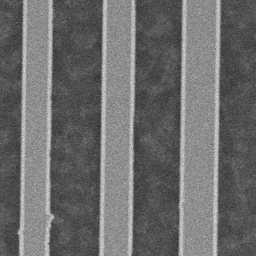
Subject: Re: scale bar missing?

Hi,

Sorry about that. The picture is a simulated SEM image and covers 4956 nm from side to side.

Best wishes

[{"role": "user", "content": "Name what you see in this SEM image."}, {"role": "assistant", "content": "one or a few lines or trenches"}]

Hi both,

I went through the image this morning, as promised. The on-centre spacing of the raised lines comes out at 1.58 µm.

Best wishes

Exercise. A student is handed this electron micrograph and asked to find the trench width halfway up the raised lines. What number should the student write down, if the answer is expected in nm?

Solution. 989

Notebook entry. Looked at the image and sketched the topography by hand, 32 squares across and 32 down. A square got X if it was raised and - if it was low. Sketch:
---XXX-------XXXX------XXXX-----
---XXX-------XXXX------XXXX-----
---XXX-------XXXX------XXXX-----
---XXX-------XXXX------XXXX-----
---XXX-------XXXX------XXXX-----
---XXX-------XXXX------XXXX-----
---XXX-------XXXX------XXXX-----
---XXX-------XXXX------XXXX-----
---XXX-------XXXX------XXXX-----
---XXX-------XXXX------XXXX-----
---XXX-------XXXX------XXXX-----
---XXX-------XXXX------XXXX-----
---XXX-------XXXX------XXXX-----
---XXX-------XXXX------XXXX-----
---XXX-------XXXX------XXXX-----
---XXX-------XXX-------XXXX-----
---XXX-------XXX-------XXXX-----
---XXX-------XXX-------XXXX-----
---XXX-------XXX-------XXXX-----
---XXX-------XXX-------XXXX-----
---XXX-------XXX-------XXXX-----
---XXX-------XXX-------XXXX-----
---XXX-------XXX-------XXXX-----
---XXX-------XXX-------XXXX-----
---XXX-------XXX-------XXXX-----
---XXX-------XXX-------XXXX-----
---XXX-------XXX-------XXXX-----
---XXX-------XXX-------XXXX-----
---XXX-------XXX-------XXXX-----
---XXX-------XXX-------XXXX-----
---XXX-------XXX-------XXXX-----
---XXX-------XXX-------XXXX-----